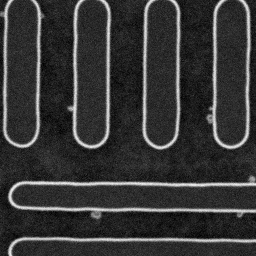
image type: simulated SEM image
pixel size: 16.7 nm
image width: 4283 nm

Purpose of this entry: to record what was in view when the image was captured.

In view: groups of lines, slits or small figures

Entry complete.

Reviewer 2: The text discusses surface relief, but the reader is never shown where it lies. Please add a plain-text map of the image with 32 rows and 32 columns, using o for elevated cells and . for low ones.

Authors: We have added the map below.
.ooo......ooo......ooo.....oooo.
.oooo....ooooo....oooo.....oooo.
.oooo....ooooo....oooo.....oooo.
.oooo....ooooo....oooo.....oooo.
.oooo....ooooo....oooo.....oooo.
.oooo....ooooo....oooo.....oooo.
.oooo....oooo.....oooo.....oooo.
.oooo....oooo.....oooo.....oooo.
.oooo....oooo.....oooo.....oooo.
.oooo....oooo.....oooo.....oooo.
.oooo....oooo.....oooo.....oooo.
.oooo....oooo.....oooo.....oooo.
.oooo....oooo.....oooo.....oooo.
.oooo....oooo.....oooo.....oooo.
.oooo....oooo.....oooo.....oooo.
.oooo....oooo.....oooo.....oooo.
.oooo....oooo.....oooo.....oooo.
.ooo......ooo.....oooo.....oooo.
................................
................................
................................
................................
................................
..oooooooooooooooooooooooooooooo
.ooooooooooooooooooooooooooooooo
..oooooooooooooooooooooooooooooo
................................
................................
................................
................................
..oooooooooooooooooooooooooooooo
.ooooooooooooooooooooooooooooooo